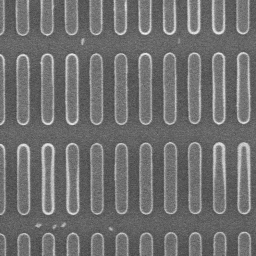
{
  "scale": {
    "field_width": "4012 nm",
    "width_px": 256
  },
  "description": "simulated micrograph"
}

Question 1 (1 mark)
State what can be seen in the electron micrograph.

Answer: groups of lines, slits or small figures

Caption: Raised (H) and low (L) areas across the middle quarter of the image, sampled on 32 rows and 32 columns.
LHHLLLLHHLLLLHHHLLLHHHLLLHHHLLLH
LHHLLLLHHLLLLHHHLLLHHHLLLHHHLLLH
LHHLLLLHHHLLLHHHLLLHHHLLLHHHLLLH
LHHLLLLHHHLLLHHHLLLHHHLLLHHHLLLH
LHHLLLLHHLLLLHHHLLLHHHLLLHHHLLLH
LHHLLLLHHLLLLHHHLLLHHHLLLHHHLLLH
LHHLLLLHHHLLLHHHLLLHHHLLLHHHLLLH
LHHLLLLHHHLLLHHHLLLHHHLLLHHHLLLH
LHHLLLLHHHLLLHHHLLLHHHLLLHHHLLLH
LHHLLLLHHHLLLHHHLLLHHHLLLHHHLLLH
LHHLLLLHHHLLLHHHLLLHHHLLLHHHLLLH
LHHLLLLHHHLLLHHHLLLHHHLLLHHHLLLH
LHHLLLLHHHLLLHHHLLLHHHLLLHHHLLLH
LHHLLLLHHHLLLHHHLLLHHHLLLHHHLLLH
LHHLLLLHHLLLLHHLLLLHHLLLLHHHLLLL
LLLLLLLLLLLLLLLLLLLLLLLLLLLLLLLL
LLLLLLLLLLLLLLLLLLLLLLLLLLLLLLLL
LLLLLLLLLLLLLLLLLLLLLLLLLLLLLLLL
LLLLLLLLLLLLLLLLLLLLLLLLLLLLLLLL
LLLLLLLLLLLLLLLLLLLLLLLLLLLLLLLL
LHHLLLLHHLLLLHHLLLLHHHLLLHHHLLLH
LHHHLLLHHHLLLHHHLLLHHHLLLHHHLLLH
LHHHLLLHHHLLLHHHLLLHHHLLLHHHLLLH
LHHHLLLHHHLLLHHHLLLHHHLLLHHHLLLH
LHHHLLLHHHLLLHHHLLLHHHLLLHHHLLLH
LHHHLLLHHHLLLHHHLLLHHHLLLHHHLLLH
LHHLLLLHHHLLLHHHLLLHHHLLLHHHLLLH
LHHLLLLHHHLLLHHHLLLHHHLLLHHHLLLH
LHHLLLLHHHLLLHHHLLLHHHLLLHHHLLLH
LHHLLLLHHHLLLHHHLLLHHHLLLHHHLLLH
LHHLLLLHHHLLLHHHLLLHHHLLLHHHLLLH
LHHLLLLHHHLLLHHHLLLHHHLLLHHHLLLH